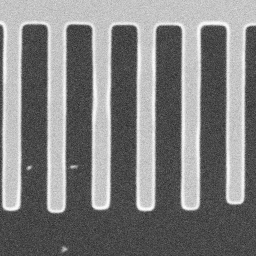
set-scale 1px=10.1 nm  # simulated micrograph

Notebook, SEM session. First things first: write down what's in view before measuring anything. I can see groups of lines, slits or small figures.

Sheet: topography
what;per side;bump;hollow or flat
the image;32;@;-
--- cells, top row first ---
@@@@@@@@@@@@@@@@@@@@@@@@@@@@@@@@
@@@@@@@@@@@@@@@@@@@@@@@@@@@@@@@@
@@@@@@@@@@@@@@@@@@@@@@@@@@@@@@@@
-@@---@@----@@---@@@---@@---@@@-
-@@---@@----@@---@@----@@---@@@-
-@@---@@----@@---@@----@@---@@@-
-@@---@@----@@---@@----@@---@@--
-@@---@@----@@---@@----@@---@@--
-@----@@----@@---@@----@@---@@--
-@----@@----@@---@@----@@---@@--
-@----@@----@@---@@----@@---@@--
-@----@@----@@---@@----@@---@@--
-@----@@----@@---@@----@@---@@--
-@----@@----@@---@@----@@---@@--
-@----@@----@@---@@----@@---@@--
@@----@@----@@---@@----@@---@@--
@@----@@----@@---@@----@@---@@--
@@----@@----@@---@@----@@---@@--
@@----@@----@@---@@----@@---@@--
@@----@@----@@---@@----@@---@@--
@@----@@----@@---@@----@@---@@--
@@----@@----@@---@@----@@---@@--
@@----@@----@@---@@----@@---@@--
@@----@@----@@---@@----@@---@@--
@@----@@----@@---@@----@@---@@--
@@----@@----@----@@----@@-------
--------------------------------
--------------------------------
--------------------------------
--------------------------------
--------------------------------
--------------------------------